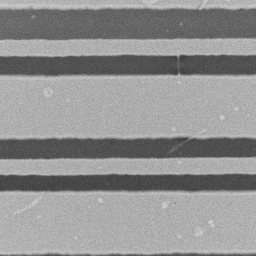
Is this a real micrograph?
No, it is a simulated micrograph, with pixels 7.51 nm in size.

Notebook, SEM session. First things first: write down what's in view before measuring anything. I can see lines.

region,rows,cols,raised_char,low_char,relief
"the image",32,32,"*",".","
********************************
................................
................................
................................
................................
********************************
********************************
................................
................................
******.*************************
********************************
********************************
********************************
********************************
********************************
********************************
********************************
................................
................................
................................
********************************
********************************
................................
................................
********************************
********************************
********************************
********************************
********************************
********************************
********************************
********************************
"